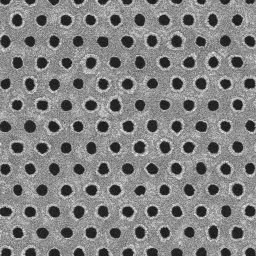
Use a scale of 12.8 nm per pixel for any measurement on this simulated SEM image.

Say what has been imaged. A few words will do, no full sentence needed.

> a regular array of holes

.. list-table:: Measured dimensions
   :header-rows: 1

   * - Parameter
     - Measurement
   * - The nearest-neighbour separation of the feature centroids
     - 307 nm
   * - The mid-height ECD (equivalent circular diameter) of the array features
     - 11.2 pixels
